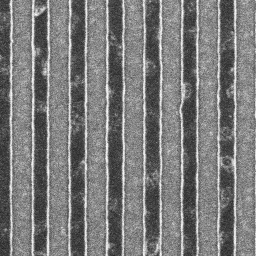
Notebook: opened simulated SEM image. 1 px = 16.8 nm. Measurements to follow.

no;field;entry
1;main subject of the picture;parallel lines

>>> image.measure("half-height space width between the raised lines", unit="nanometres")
350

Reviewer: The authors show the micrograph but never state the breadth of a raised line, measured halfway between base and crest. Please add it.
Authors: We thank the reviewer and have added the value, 285 nm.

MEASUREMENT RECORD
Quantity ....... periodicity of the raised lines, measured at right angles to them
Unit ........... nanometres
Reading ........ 626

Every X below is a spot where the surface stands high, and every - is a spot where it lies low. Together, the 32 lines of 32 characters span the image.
X---XX---XX--XX---XX---XX--XX---
X---XX---XX--XX---XX---XX--XX---
X---XX---XX--XX---XX---XX--XX---
XX--XX---XX--XX---XX---XX--XX---
X---XX---XX--XX---XX---XX--XX---
X---XX---XX--XX---XX---XX--XX---
X---XX---XX--XX---XX---XX--XX---
X---XX---XX--XX---XX---XX--XX---
X---XX---XX--XX---XX---XX--XX---
X---XX---XX--XX---XX---XX--XX---
X---XX---XX--XXX--XX---XX--XX---
X---XX---XX--XX---XX---XX--XX---
X---XX---XX--XX---XX---XX--XX---
X---XX---XX--XX---XX---XX--XX---
X---XX---XX--XX---XX---XX--XX---
X---XX---XX--XX---XX---XX--XX---
X---XX---XX--XX---XX---XX--XX---
X---XX---XX--XX---XX---XX--XX---
X---XX---XX--XX---XX---XX--XX---
X---XX---XX--XX---XX---XX--XX---
X---XX---XX--XX---XX---XX--XX---
X---XX---XX--XX---XX---XX--XX---
X---XX---XX--XX---XX---XX--XX---
X---XX---XX--XX---XX---XX--XX---
X---XX---XX--XX---XX---XX--XX---
X---XX---XX--XX---XX---XX--XX---
X---XX---XX--XX---XX---XX--XX---
X---XX---XX--XX---XX---XX--XX---
X---XX---XX--XX---XX---XX--XX---
X---XX---XX--XX---XX---XX--XX---
X---XX---XX--XX---XX---XX--XX---
X---XX---XX--XX---XX---XX--XX---